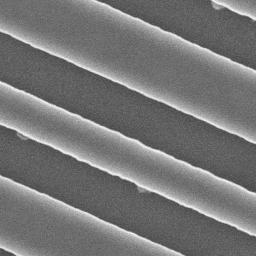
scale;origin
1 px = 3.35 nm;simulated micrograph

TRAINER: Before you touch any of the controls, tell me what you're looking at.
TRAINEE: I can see lines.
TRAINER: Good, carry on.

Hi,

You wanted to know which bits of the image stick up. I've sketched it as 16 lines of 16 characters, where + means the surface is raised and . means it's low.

+++++++.......++
+++++++++.......
.+++++++++++....
....++++++++++..
......++++++++++
+.......++++++++
+++.......++++++
+++++........+++
..++++++.......+
....++++++......
......++++++....
+.......+++++++.
++++.......+++++
++++++.......+++
++++++++.......+
++++++++++......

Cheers